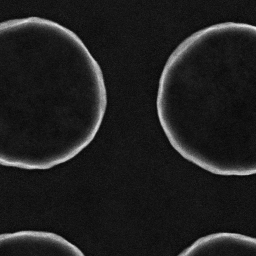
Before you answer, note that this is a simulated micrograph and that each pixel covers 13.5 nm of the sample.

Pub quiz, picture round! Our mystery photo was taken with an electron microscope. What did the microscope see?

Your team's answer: raised bodies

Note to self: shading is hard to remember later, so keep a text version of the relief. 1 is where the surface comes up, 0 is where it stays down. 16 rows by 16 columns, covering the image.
0000000000000000
0110000000000000
1111100000001111
1111110000011111
1111110000111111
1111110000111111
1111110000111111
1111110000111111
1111110000011111
1111100000011111
0000000000000111
0000000000000000
0000000000000000
0000000000000000
0000000000000000
1111100000001111